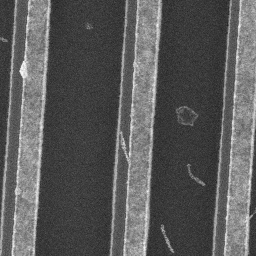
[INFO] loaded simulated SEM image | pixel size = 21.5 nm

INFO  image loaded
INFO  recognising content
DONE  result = lines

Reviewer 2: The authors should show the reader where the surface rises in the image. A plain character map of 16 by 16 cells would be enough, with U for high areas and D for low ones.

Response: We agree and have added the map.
DUUDDDDDUUDDDDUU
DUUDDDDDUUDDDDUU
DUUDDDDDUUDDDDUU
DUUDDDDDUUDDDDUU
DUUDDDDDUUDDDDUU
DUUDDDDDUUDDDDUU
DUUDDDDDUUDDDDUU
DUUDDDDUUUDDDDUU
DUUDDDDUUDDDDDUU
UUDDDDDUUDDDDDUU
UUDDDDDUUDDDDDUU
UUDDDDDUUDDDDDUU
UUDDDDDUUDDDDDUU
UUDDDDDUUDDDDDUU
UUDDDDDUUDDDDUUD
UUDDDDDUUDDDDUUD